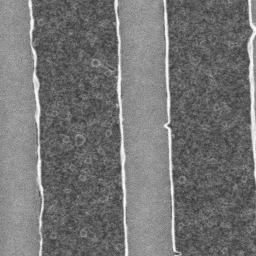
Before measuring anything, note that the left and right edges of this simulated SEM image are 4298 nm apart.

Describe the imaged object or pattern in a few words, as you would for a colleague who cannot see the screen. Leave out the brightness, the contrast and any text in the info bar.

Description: one or a few lines or trenches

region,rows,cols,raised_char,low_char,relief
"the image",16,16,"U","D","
DDUUUUUDDDUUUUUU
DDUUUUUDDDUUUUUU
DDUUUUUDDDUUUUUU
DDUUUUUDDDUUUUUU
DDUUUUUDDDUUUUUU
DDUUUUUDDDUUUUUU
DDUUUUUDDDDUUUUU
DDUUUUUUDDUUUUUU
DDUUUUUUDDDUUUUU
DDUUUUUUDDDUUUUU
DDUUUUUUDDDUUUUU
DDDUUUUUDDDUUUUU
DDDUUUUUDDDUUUUU
DDDUUUUUDDDUUUUU
DDDUUUUUDDDUUUUU
DDDUUUUUDDDUUUUU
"